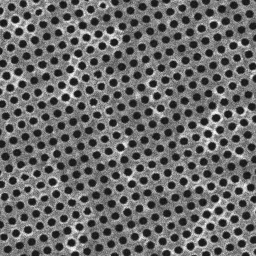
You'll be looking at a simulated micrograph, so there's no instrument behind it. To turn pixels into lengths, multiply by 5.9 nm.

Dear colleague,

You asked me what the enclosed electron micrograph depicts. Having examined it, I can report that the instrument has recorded a regular array of holes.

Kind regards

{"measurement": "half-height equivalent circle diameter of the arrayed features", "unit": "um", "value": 0.0489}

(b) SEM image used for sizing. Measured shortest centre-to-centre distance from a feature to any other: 73.3 nanometers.